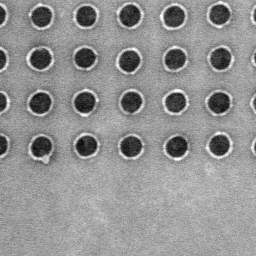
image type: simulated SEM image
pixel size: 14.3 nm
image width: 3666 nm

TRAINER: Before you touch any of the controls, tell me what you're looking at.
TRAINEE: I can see a regular array of raised bodies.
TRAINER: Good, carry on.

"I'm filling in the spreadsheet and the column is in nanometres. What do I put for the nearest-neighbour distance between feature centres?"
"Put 614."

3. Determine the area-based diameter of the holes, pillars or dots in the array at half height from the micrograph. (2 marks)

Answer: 0.344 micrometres